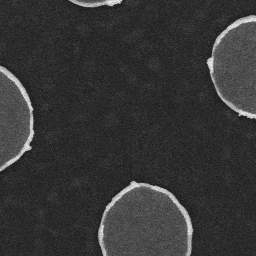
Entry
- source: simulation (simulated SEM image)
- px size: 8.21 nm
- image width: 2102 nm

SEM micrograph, raised bodies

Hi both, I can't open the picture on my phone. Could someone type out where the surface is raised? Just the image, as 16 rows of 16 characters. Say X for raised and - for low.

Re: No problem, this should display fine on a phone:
----------------
---------------X
--------------XX
-------------XXX
-------------XXX
X-------------XX
XX------------XX
XX--------------
XX--------------
XX--------------
----------------
--------X-------
-------XXXX-----
------XXXXXX----
------XXXXXX----
------XXXXXX----